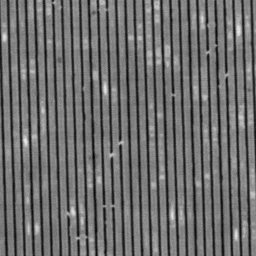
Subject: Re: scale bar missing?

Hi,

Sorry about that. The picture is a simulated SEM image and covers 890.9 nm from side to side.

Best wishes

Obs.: parallel lines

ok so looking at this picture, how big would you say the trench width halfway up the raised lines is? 8.7 nanometres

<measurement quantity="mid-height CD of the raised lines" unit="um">0.0235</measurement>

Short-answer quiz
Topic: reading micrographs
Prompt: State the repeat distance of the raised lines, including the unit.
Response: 0.0314 um